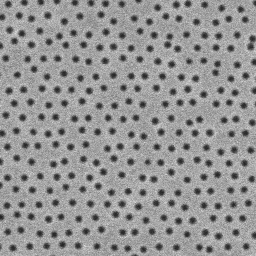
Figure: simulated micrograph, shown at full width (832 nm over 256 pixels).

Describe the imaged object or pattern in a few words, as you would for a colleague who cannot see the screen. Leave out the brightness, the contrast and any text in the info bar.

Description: a regular array of holes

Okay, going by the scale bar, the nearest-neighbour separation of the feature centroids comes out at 43.9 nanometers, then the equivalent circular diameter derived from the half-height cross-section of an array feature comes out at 22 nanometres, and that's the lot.